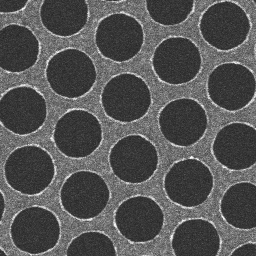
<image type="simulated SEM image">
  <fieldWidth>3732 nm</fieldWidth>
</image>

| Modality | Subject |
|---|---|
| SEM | a regular array of holes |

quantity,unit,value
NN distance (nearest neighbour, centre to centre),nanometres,876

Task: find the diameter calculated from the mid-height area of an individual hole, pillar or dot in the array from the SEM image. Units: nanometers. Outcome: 699